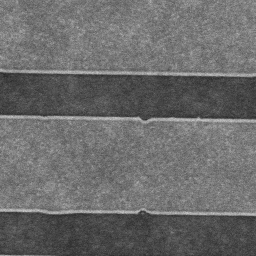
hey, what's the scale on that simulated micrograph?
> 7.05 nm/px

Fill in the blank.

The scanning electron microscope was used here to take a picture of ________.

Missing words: one or a few lines or trenches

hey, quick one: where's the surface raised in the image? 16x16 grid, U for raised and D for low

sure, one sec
UUUUUUUUUUUUUUUU
UUUUUUUUUUUUUUUU
UUUUUUUUUUUUUUUU
UUUUUUUUUUUUUUUU
DDDUUUUUUUUUUUUU
DDDDDDDDDDDDDDDD
DDDDDDDDDDDDDDDD
UUUUUUUUUUUUUDDD
UUUUUUUUUUUUUUUU
UUUUUUUUUUUUUUUU
UUUUUUUUUUUUUUUU
UUUUUUUUUUUUUUUU
UUUUUUUUUUUUUUUU
DDDDDDDDDDDDDDDD
DDDDDDDDDDDDDDDD
DDDDDDDDDDDDDDDD